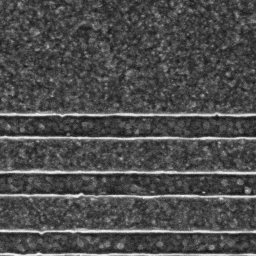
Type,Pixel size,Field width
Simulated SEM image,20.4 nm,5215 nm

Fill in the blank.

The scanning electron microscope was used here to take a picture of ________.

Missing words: parallel lines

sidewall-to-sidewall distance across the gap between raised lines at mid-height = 458 nm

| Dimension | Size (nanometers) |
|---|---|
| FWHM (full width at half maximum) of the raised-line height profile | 723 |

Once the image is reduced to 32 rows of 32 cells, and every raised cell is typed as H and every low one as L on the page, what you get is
HHHHHHHHHHHHHHHHHHHHHHHHHHHHHHHH
HHHHHHHHHHHHHHHHHHHHHHHHHHHHHHHH
HHHHHHHHHHHHHHHHHHHHHHHHHHHHHHHH
HHHHHHHHHHHHHHHHHHHHHHHHHHHHHHHH
HHHHHHHHHHHHHHHHHHHHHHHHHHHHHHHH
HHHHHHHHHHHHHHHHHHHHHHHHHHHHHHHH
HHHHHHHHHHHHHHHHHHHHHHHHHHHHHHHH
HHHHHHHHHHHHHHHHHHHHHHHHHHHHHHHH
HHHHHHHHHHHHHHHHHHHHHHHHHHHHHHHH
HHHHHHHHHHHHHHHHHHHHHHHHHHHHHHHH
HHHHHHHHHHHHHHHHHHHHHHHHHHHHHHHH
HHHHHHHHHHHHHHHHHHHHHHHHHHHHHHHH
HHHHHHHHHHHHHHHHHHHHHHHHHHHHHHHH
HHHHHHHHHHHHHHHHHHHHHHHHHHHHHHHH
LLLLLLLLLLLLLLLLLLLLLLLLLLLLLLLL
LLLLLLLLLLLLLLLLLLLLLLLLLLLLLLLL
LLLLLLLLLLLLLLLLLLLLLLLLLLLLLLLL
HHHHHHHHHHHHHHHHHHHHHHHHHHHHHHHH
HHHHHHHHHHHHHHHHHHHHHHHHHHHHHHHH
HHHHHHHHHHHHHHHHHHHHHHHHHHHHHHHH
HHHHHHHHHHHHHHHHHHHHHHHHHHHHHHHH
LLLLHHHHHHHHHHHHHHHHHHHHHHHHHHHH
LLLLLLLLLLLLLLLLLLLLLLLLLLLLLLLL
LLLLLLLLLLLLLLLLLLLLLLLLLLLLLLLL
HHHHHHHHHHHHHHHHHLLHHHHHLLLHLLLL
HHHHHHHHHHHHHHHHHHHHHHHHHHHHHHHH
HHHHHHHHHHHHHHHHHHHHHHHHHHHHHHHH
HHHHHHHHHHHHHHHHHHHHHHHHHHHHHHHH
HHHHHHHHHHHHHHHHHHHHHHHHHHHHHHHH
LLLLLLLLLLLLLLLLLLLLLLLLLLLLLLLL
LLLLLLLLLLLLLLLLLLLLLLLLLLLLLLLL
LLLLLLLLLLLLLLLLLLLLLLLLLLLLLLLL